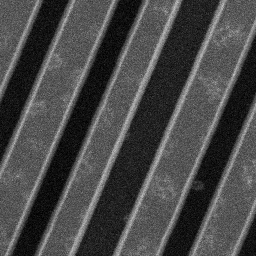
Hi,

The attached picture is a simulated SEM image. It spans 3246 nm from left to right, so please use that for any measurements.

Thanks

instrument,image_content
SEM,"one or a few lines or trenches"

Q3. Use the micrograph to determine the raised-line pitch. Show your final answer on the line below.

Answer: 897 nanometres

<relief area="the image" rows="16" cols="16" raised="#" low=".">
##..###..##...##
##..###..##..###
#..###..##...###
#..###..##..###.
#..##..##...###.
..###..##...##..
..###.##...###..
.###..##...###..
.###..##..###..#
###..##...###..#
###..##...##..##
##..##...###..##
##..##...##..###
##.###..###..###
#..##...###..##.
#..##..###..###.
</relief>